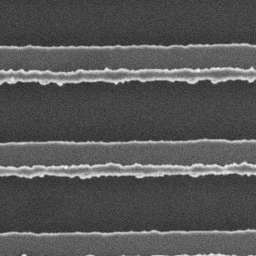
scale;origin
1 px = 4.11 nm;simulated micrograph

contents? lines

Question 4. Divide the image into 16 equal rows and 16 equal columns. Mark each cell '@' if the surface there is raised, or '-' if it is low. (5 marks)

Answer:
----------------
----------------
----------------
@@@@@@@@@@@@@@@@
@@@@@@@@@@@@@@@@
----------------
----------------
----------------
----------------
@@@@@@@@@@@@@@@@
@@@@@@@@@@@@@@@@
----------------
----------------
----------------
--------@@@@@@@@
@@@@@@@@@@@@@@@@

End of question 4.